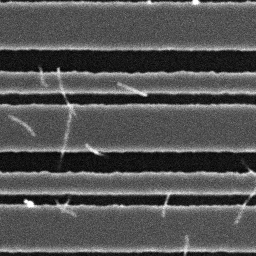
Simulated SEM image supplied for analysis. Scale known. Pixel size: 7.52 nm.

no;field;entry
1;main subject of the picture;lines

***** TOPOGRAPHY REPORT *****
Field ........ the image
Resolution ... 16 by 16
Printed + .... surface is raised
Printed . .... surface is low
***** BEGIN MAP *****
++++++++++++++++
++++++++++++++++
++++++++++++++++
................
...........+....
++++++++++++++++
++++++++++++++++
++++++++++++++++
++++++++++++++++
......+.........
................
++++++++++++++++
++++++++++++++++
++++++++++++++++
++++++++++++++++
++++++++++++++++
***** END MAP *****